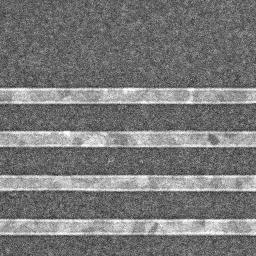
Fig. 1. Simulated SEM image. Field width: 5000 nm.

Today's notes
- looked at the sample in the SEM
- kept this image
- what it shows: parallel lines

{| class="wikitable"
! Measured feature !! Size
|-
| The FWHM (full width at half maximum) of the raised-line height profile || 249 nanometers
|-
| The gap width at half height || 30.5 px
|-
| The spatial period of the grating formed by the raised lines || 0.855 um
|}